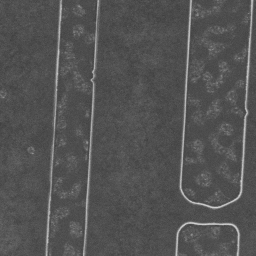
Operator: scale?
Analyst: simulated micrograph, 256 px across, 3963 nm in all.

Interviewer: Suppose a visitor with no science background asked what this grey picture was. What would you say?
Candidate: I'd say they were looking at one or a few lines or trenches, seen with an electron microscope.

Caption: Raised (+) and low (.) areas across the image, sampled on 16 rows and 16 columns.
++++..++++++....
++++..++++++....
++++..++++++....
++++..++++++....
++++..++++++...+
++++..++++++...+
+++...++++++...+
+++...++++++...+
+++...+++++....+
+++...+++++....+
+++...+++++....+
+++..++++++....+
+++..+++++++...+
+++..+++++++++++
+++..++++++....+
+++..++++++....+